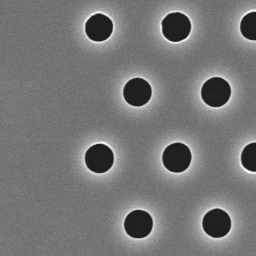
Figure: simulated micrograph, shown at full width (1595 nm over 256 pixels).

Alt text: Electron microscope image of a regular array of holes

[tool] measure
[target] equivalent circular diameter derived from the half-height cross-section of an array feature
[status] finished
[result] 181 nm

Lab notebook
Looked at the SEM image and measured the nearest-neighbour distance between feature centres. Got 474 nm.